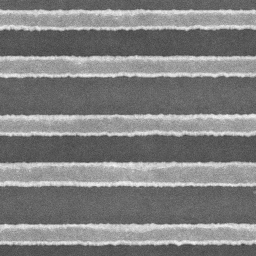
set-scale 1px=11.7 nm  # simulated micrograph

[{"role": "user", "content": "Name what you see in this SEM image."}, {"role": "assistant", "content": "lines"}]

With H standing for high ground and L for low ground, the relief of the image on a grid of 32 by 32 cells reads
LLLLLLLLLLLLLLLLLLLLLLLLLLLLLLLL
HHHHHHHHHHHHHHHHHHHHHHHHHHHHHHHH
HHHHHHHHHHHHHHHHHHHHHHHHHHHHHHHH
HHHHHHHHHHHHHHHHHHHHHHHHHHHHHHHH
LLLLLLLLLLLLLLLLLLLLLLLLLLLLLLLL
LLLLLLLLLLLLLLLLLLLLLLLLLLLLLLLL
LLLLLLLLLLLLLLLLLLLLLLLLLLLLLLLL
HHHHHHHHHHHHHHHHHHHHHHHHHHHHHHHH
HHHHHHHHHHHHHHHHHHHHHHHHHHHHHHHH
HHHHHHHHLHLLLHHLLLHHLHLLLLLLLLLL
LLLLLLLLLLLLLLLLLLLLLLLLLLLLLLLL
LLLLLLLLLLLLLLLLLLLLLLLLLLLLLLLL
LLLLLLLLLLLLLLLLLLLLLLLLLLLLLLLL
LLLLLLLLLLLLLLLLLLLLLLLLLLLLLLLL
HHHHHHHHHHHHHHHHHHHHHHHHHHHHHHHH
HHHHHHHHHHHHHHHHHHHHHHHHHHHHHHHH
HHHHHHHHHHHHHHHHHHHHHHHHHHHHHHHH
LLLLLLLLLLLLLLLLLLLLLLLLLLLLLLLL
LLLLLLLLLLLLLLLLLLLLLLLLLLLLLLLL
LLLLLLLLLLLLLLLLLLLLLLLLLLLLLLLL
LLHHHHHHHHHHHHHHHHHHHHHHHHHHHHHH
HHHHHHHHHHHHHHHHHHHHHHHHHHHHHHHH
HHHHHHHHHHHHHHHHHHHHHHHHHHHHHHHH
LLLLLLLLLLLLLLLLLLLLLLLLLLLLLLLL
LLLLLLLLLLLLLLLLLLLLLLLLLLLLLLLL
LLLLLLLLLLLLLLLLLLLLLLLLLLLLLLLL
LLLLLLLLLLLLLLLLLLLLLLLLLLLLLLLL
LLLLLLLLLLLLLLLLLLLLLLLLLLLLLLLL
HHHHHHHHHHHHHHHHHHHHHHHHHHHHHHHH
HHHHHHHHHHHHHHHHHHHHHHHHHHHHHHHH
HLHHHHHHHLHHHHHLHHLHLLHLLLLLLHLL
LLLLLLLLLLLLLLLLLLLLLLLLLLLLLLLL